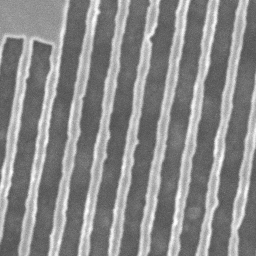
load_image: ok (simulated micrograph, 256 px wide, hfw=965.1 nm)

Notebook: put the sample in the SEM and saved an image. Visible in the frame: parallel lines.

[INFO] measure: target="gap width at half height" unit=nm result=74.4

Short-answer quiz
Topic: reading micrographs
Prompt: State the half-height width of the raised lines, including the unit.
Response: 35.8 nm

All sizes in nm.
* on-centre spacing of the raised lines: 111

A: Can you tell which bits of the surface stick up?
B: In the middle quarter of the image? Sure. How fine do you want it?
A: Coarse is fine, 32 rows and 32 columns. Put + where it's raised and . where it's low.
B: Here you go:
....++.....+++.....++.....+++...
....++.....+++.....++.....+++...
...+++.....++.....+++.....++....
...+++.....++.....++......++....
...+++....+++.....++......++....
...++.....+++.....++.....+++....
...++.....+++.....++.....+++....
..+++.....+++.....++.....+++....
..+++.....++.....+++.....++.....
..+++.....++.....+++.....++.....
..++......++.....+++.....++.....
..++......++.....++......++.....
..++......++.....++.....++......
.+++.....++......++.....++......
.+++.....++......++.....++.....+
.+++.....++.....++.....+++.....+
.+++.....++.....++.....+++.....+
.+++.....++.....++.....+++.....+
.+++....+++.....++......++.....+
.++.....+++.....+++....++......+
.++.....+++.....++.....++.....++
+++.....++.....++......++.....++
+++....+++.....++......++.....++
+++.....++.....++......++.....++
++.....+++.....++.....++......++
++.....+++.....++.....++.....+++
++.....+++.....++.....++.....+++
++.....++.....+++....+++.....+++
+......++.....+++....+++.....+++
+......++.....+++....+++.....++.
+.....+++.....++.....+++.....++.
+.....+++.....++.....+++.....++.